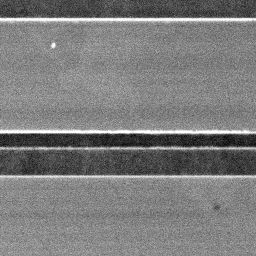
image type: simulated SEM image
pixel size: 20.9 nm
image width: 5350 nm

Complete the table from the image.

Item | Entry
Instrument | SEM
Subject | lines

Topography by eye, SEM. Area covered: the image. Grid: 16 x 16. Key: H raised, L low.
LLLLLLLLLLLLLLLL
HHHHHHHHHHHHHHHH
HHHHHHHHHHHHHHHH
HHHHHHHHHHHHHHHH
HHHHHHHHHHHHHHHH
HHHHHHHHHHHHHHHH
HHHHHHHHHHHHHHHH
HHHHHHHHHHHHHHHH
LLLLLLLLLLLLLLLL
LLLLLLLLLLLLLLLL
LLLLLLLLLLLLLLLL
HHHHHHHHHHHHHHHH
HHHHHHHHHHHHHHHH
HHHHHHHHHHHHHHHH
HHHHHHHHHHHHHHHH
HHHHHHHHHHHHHHHH